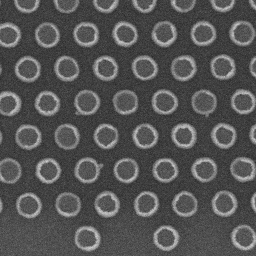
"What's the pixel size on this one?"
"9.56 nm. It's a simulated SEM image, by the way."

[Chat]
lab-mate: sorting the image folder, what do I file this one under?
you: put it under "a regular array of raised bodies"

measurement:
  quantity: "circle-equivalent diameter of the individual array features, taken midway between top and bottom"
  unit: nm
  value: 225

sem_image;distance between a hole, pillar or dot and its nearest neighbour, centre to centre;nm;370